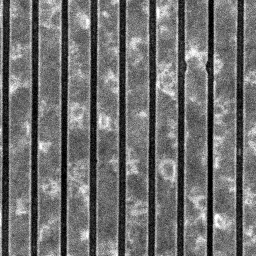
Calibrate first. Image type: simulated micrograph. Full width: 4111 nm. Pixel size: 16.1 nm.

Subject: parallel lines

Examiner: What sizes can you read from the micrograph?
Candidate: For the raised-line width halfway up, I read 0.367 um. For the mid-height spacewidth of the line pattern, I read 112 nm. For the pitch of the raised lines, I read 0.47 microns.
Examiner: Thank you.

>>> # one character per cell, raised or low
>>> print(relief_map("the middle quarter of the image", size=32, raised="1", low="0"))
01111100111111001111100111110001
01111100111111001111100111110001
01111100111111001111100111110011
01111100111111001111100111110011
01111100111111001111100111110011
01111100111111001111100111110011
01111100111111001111100111110011
01111100111111001111100111110011
01111100111111001111100111110011
01111100111111001111100111110011
01111100111111001111100111110011
01111100111111001111100111110011
01111100111111001111100111110011
01111100111111001111100111110011
01111100111111001111100111110011
01111100111111001111100111110011
01111100111111001111100111110011
01111100111111001111100111110011
01111100111111001111100111110011
01111100111111001111100111110011
01111100111111001111100111110011
01111100111111001111100111110011
01111100111111001111100111110011
01111100111111001111100111110011
01111100111111001111100111110011
01111100111111001111100111110011
01111100111111001111100111110011
01111100111111001111100111110011
01111100111111001111100111110011
01111100111111011111100111110011
01111100111111011111100111110011
01111100111110011111100111110011